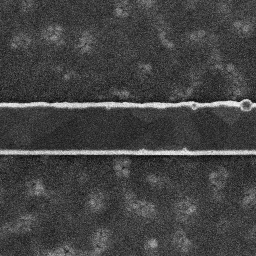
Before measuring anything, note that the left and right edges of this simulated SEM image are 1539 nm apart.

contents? one or a few lines or trenches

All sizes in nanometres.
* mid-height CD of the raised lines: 289